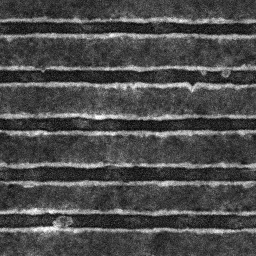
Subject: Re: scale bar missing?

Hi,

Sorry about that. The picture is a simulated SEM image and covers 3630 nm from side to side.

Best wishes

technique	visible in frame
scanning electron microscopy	parallel lines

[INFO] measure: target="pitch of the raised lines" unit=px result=48.5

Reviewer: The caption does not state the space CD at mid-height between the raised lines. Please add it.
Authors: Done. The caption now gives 0.239 micrometres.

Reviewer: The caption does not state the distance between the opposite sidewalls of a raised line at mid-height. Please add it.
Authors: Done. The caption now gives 31.8 px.